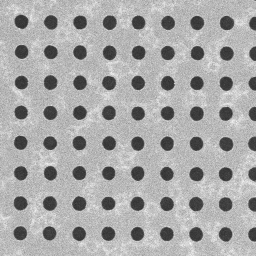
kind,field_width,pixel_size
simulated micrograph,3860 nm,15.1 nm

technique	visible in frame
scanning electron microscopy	a regular array of holes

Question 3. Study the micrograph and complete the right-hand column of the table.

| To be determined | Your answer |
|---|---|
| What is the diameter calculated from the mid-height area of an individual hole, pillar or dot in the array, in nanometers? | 211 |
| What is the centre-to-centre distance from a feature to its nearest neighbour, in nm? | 438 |